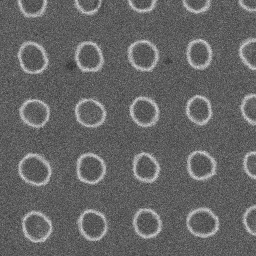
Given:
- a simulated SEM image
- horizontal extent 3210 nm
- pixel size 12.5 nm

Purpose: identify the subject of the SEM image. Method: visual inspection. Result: a regular array of raised bodies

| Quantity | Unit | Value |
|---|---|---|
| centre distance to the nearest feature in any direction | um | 0.69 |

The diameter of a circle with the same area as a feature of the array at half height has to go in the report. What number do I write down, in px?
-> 27.5